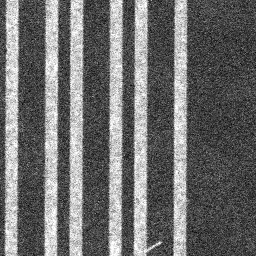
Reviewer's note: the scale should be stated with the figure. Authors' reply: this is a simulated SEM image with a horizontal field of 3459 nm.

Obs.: parallel lines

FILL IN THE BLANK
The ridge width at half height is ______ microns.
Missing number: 0.155